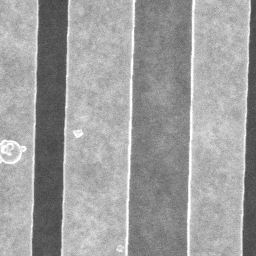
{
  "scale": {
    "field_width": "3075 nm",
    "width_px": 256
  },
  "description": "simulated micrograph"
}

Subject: lines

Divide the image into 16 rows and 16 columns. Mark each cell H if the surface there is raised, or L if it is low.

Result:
HHLLHHHHLLLLHHHH
HHLLHHHHLLLLHHHH
HHLLHHHHLLLLHHHH
HHLLHHHHLLLLHHHH
HHLLHHHHLLLLHHHH
HHLLHHHHLLLLHHHL
HHLLHHHHLLLLHHHL
HHLLHHHHLLLLHHHL
HHLLHHHHLLLLHHHL
HHLLHHHHLLLLHHHL
HHLLHHHHLLLLHHHL
HHLLHHHHLLLLHHHL
HHLLHHHHLLLLHHHL
HHLLHHHHLLLLHHHL
HHLLHHHHLLLLHHHL
HHLLHHHHLLLLHHHL